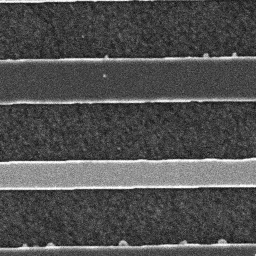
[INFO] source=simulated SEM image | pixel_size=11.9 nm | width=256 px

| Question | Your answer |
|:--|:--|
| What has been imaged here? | lines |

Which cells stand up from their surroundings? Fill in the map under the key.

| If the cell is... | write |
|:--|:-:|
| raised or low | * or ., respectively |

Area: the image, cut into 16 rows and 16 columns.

................
................
................
................
****************
****************
................
................
................
................
****************
****************
................
................
................
.***************